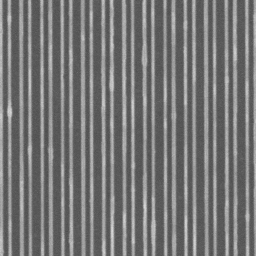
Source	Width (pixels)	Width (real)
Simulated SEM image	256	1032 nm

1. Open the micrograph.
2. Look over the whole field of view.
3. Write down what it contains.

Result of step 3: parallel lines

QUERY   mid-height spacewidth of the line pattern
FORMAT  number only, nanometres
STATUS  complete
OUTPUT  25.2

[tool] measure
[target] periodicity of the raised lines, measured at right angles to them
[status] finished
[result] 41.6 nm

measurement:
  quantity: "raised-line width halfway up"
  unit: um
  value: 0.0106